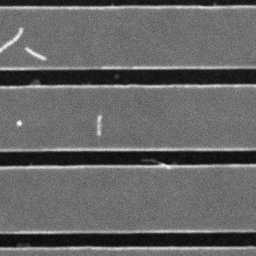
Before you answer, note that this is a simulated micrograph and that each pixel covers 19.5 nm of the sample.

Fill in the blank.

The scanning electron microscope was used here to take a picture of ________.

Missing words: lines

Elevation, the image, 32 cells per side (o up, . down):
................................
oooooooooooooooooooooooooooooooo
oooooooooooooooooooooooooooooooo
oooooooooooooooooooooooooooooooo
oooooooooooooooooooooooooooooooo
oooooooooooooooooooooooooooooooo
oooooooooooooooooooooooooooooooo
oooooooooooooooooooooooooooooooo
oooooooooooooooooooooooooooooo..
................................
................................
oooooooooooooooooooooooooooooooo
oooooooooooooooooooooooooooooooo
oooooooooooooooooooooooooooooooo
oooooooooooooooooooooooooooooooo
oooooooooooooooooooooooooooooooo
oooooooooooooooooooooooooooooooo
oooooooooooooooooooooooooooooooo
oooooooooooooooooooooooooooooooo
................................
................................
oooooooooooooooooooooooooooooooo
oooooooooooooooooooooooooooooooo
oooooooooooooooooooooooooooooooo
oooooooooooooooooooooooooooooooo
oooooooooooooooooooooooooooooooo
oooooooooooooooooooooooooooooooo
oooooooooooooooooooooooooooooooo
oooooooooooooooooooooooooooooooo
................................
................................
oooooooooooooooooooooooooooooooo